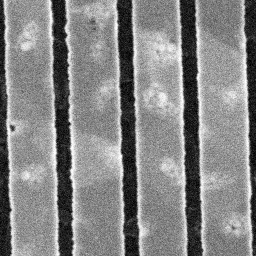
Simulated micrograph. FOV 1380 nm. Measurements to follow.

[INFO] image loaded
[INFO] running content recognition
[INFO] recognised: one or a few lines or trenches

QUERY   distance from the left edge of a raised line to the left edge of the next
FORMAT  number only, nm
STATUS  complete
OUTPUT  346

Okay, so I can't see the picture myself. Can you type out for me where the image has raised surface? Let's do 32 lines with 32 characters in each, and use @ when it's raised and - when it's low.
-@@@@@--@@@@@@@--@@@@@--@@@@@@@-
-@@@@@--@@@@@@@--@@@@@--@@@@@@@-
-@@@@@--@@@@@@@--@@@@@@--@@@@@@-
-@@@@@--@@@@@@@--@@@@@@--@@@@@@-
-@@@@@--@@@@@@@--@@@@@@--@@@@@@-
-@@@@@@-@@@@@@@--@@@@@@--@@@@@@-
-@@@@@@--@@@@@@--@@@@@@--@@@@@@-
-@@@@@@-@@@@@@@--@@@@@@--@@@@@@-
-@@@@@@--@@@@@@--@@@@@@--@@@@@@-
-@@@@@@--@@@@@@--@@@@@@--@@@@@@-
-@@@@@@--@@@@@@--@@@@@@--@@@@@@-
@@@@@@@@@@@@@@@--@@@@@@--@@@@@@-
@@@@@@@--@@@@@@--@@@@@@--@@@@@@-
-@@@@@@--@@@@@@--@@@@@@--@@@@@@-
-@@@@@@--@@@@@@--@@@@@@--@@@@@@-
-@@@@@@--@@@@@@--@@@@@@--@@@@@@-
-@@@@@@--@@@@@@--@@@@@@--@@@@@@-
-@@@@@@--@@@@@@--@@@@@@--@@@@@@-
-@@@@@@--@@@@@@--@@@@@@--@@@@@@-
-@@@@@@--@@@@@@--@@@@@@--@@@@@@-
-@@@@@@--@@@@@@--@@@@@@--@@@@@@-
-@@@@@@--@@@@@@--@@@@@@--@@@@@@-
-@@@@@@--@@@@@@--@@@@@@--@@@@@@-
-@@@@@@--@@@@@@--@@@@@@--@@@@@@-
-@@@@@@--@@@@@@--@@@@@@--@@@@@@-
-@@@@@@--@@@@@@--@@@@@@--@@@@@@-
-@@@@@@--@@@@@@--@@@@@@--@@@@@@-
-@@@@@@--@@@@@@--@@@@@@--@@@@@@-
-@@@@@@--@@@@@@--@@@@@@--@@@@@@-
--@@@@@--@@@@@@--@@@@@@--@@@@@@@
-@@@@@@--@@@@@@--@@@@@@--@@@@@@-
--@@@@@--@@@@@@@-@@@@@@--@@@@@@-